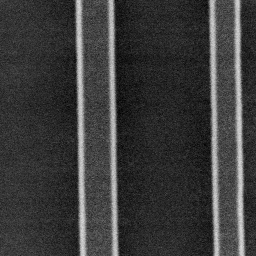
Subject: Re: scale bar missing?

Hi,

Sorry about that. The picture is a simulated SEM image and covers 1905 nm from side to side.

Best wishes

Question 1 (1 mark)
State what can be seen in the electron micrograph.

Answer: one or a few lines or trenches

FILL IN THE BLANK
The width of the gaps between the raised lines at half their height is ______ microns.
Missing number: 0.754